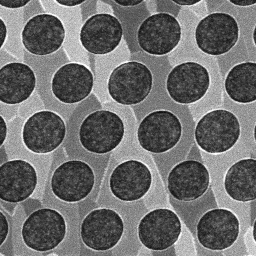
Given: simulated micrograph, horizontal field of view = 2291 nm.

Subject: a regular array of holes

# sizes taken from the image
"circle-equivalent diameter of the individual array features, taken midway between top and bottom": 382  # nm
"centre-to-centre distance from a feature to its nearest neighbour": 506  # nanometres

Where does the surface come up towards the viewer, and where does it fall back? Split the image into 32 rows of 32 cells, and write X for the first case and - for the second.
---XXXX---XXXXX--XXXXX--XXXXX---
XXXXXXXXXXXXXXXXXXXXXXXXXXXXXXXX
XXXX---XXXX----XXX----XXX----XXX
-XX-----XX-----XX------XX-----XX
-XX-----XX-----XX------X------XX
XXX-----XX-----XX-----XXX----XXX
XXXX---XXXX---XXXX---XXXX---XXXX
XXXXXXXXXXXXXXXXXXXXXXXXXXXXXXXX
----XXXX---XXX----XXXX----XXX---
----XXX-----XX-----XX-----XX----
----XX------XX-----XX-----XX----
----XXX----XXX-----XX-----XX----
---XXXX---XXXX----XXXX---XXXX---
XXXXXXXXXXXXXXXXXXXXXXXXXXXXXXXX
XXXX---XXXX----XXX----XXXX---XXX
-XX-----XX-----XXX-----XX-----XX
-XX-----XX-----XX------X------XX
-XX-----XX-----XX-----XX------XX
XXX----XXXX---XXXX---XXXX----XXX
XXXXXXXXXXXXXXXXXXXXXXXXXXXXXXXX
----XXXX---XXXX---XXXX---XXXX---
----XXX-----XX-----XX-----XX----
-----X------XX-----XX-----XX----
----XX------XX-----XX-----XX----
----XXX----XXX----XXXX---XXXX---
XXXXXXXXXXXXXXXXXXXXXXXXXXXXXXXX
XXXX---XXXX---XXXXX---XXXX---XXX
-XX-----XX-----XXX----XXX-----XX
-XX-----XX-----XX------XX-----XX
-XX-----XX-----XX-----XXX-----XX
XXX----XXXX----XXX----XXX----XXX
XXXXXXXXXXXXXXXXXXXXXXXXXXXXXXXX